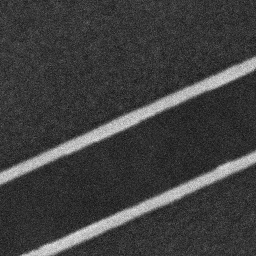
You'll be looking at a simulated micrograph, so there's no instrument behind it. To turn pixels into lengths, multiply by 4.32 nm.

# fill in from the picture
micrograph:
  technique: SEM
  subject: one or a few lines or trenches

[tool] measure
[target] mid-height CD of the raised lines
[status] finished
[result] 381 nm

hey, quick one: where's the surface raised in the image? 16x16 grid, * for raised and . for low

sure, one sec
................
................
................
................
...............*
............****
..........******
........********
......**********
....************
.**************.
************....
**********......
********........
******..........
****............